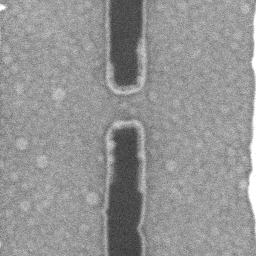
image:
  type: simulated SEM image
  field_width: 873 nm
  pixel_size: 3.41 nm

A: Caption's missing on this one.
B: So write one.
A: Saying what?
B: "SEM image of one or a few lines or trenches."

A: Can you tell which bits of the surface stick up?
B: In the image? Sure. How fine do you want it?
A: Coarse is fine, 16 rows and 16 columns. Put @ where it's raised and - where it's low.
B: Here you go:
-------@@-------
-------@@-------
-------@@-------
-------@@-------
-------@@-------
-------@@-------
----------------
----------------
-------@@-------
-------@@-------
-------@@-------
-------@@-------
-------@@-------
-------@@-------
-------@@-------
-------@@-------